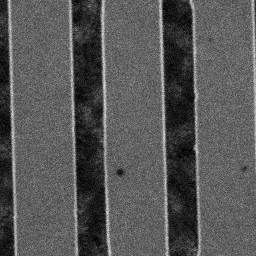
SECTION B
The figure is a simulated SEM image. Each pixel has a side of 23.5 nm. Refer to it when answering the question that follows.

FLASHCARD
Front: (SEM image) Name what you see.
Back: one or a few lines or trenches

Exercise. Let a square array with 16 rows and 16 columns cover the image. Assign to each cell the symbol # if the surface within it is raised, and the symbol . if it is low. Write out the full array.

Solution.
.###..####..####
.###..####..####
.###..####..####
.###..####..####
.###...###..####
.####..###..####
.####..###..####
.####..###..####
.####..###..####
.####..###..####
.####..###..####
.####..###..####
.####..###..####
.####..###..####
.####..###..####
.####..###..####